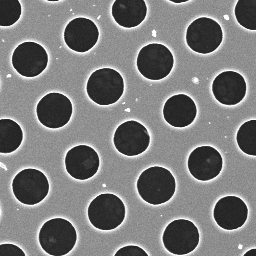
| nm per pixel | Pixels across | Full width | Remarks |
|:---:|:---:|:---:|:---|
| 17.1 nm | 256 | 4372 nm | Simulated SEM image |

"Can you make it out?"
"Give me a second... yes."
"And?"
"a regular array of holes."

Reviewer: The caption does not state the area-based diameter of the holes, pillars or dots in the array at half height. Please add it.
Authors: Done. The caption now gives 610 nanometers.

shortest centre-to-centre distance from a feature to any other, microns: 0.944